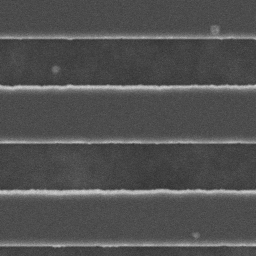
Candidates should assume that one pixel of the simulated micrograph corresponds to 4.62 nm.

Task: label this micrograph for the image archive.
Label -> lines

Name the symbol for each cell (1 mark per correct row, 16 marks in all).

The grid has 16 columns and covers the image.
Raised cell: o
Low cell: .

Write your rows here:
oooooooooooooooo
oooooooooooooooo
................
................
................
oooooooooooooooo
oooooooooooooooo
oooooooooooooooo
oooooooooooooooo
................
................
................
oooooooooooooooo
oooooooooooooooo
oooooooooooooooo
................